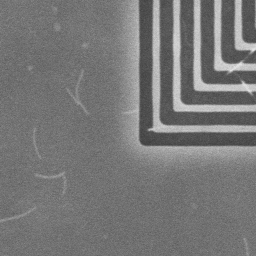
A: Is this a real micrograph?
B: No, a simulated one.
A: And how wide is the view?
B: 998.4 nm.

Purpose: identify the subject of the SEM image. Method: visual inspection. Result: groups of lines, slits or small figures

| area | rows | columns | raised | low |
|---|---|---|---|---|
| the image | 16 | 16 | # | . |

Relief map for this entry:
#########.......
#########.......
#########.......
#########.......
#########.......
#########...#...
#########..#....
#########.......
#########.......
################
################
################
################
################
################
################